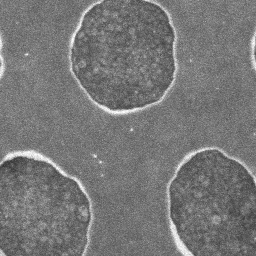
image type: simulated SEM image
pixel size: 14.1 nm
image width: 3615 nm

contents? holes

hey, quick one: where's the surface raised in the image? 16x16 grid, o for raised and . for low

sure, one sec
oooooo....oooooo
ooooo......ooooo
ooooo......ooooo
oooo.......ooooo
ooooo......ooooo
ooooo......ooooo
oooooo...ooooooo
oooooooooooooooo
oooooooooooooooo
ooooooooooooo.oo
...oooooooo....o
.....oooooo.....
.....oooooo.....
......ooooo.....
.....oooooo.....
.....ooooooo....